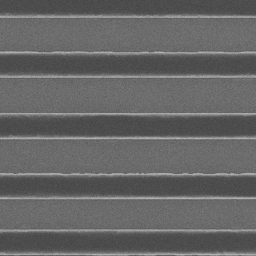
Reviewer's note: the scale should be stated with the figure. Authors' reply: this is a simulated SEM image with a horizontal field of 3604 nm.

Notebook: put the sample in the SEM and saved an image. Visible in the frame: lines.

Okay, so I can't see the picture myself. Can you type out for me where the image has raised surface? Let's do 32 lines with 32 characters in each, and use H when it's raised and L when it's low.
HHHHHHHHHHHHHHHHHHHHHHHHHHHHHHHH
HHHHHHHHHHHHHHHHHHHHHHHHHHHHHHHH
LLLLLLLLLLLLLLLLLLLLLLLLLLLLLLLL
LLLLLLLLLLLLLLLLLLLLLLLLLLLLLLLL
LLLLLLLLLLLLLLLLLLLLLLLLLLLLLLLL
LLLLLLLLLLLLLLLLLLLLLLLLLLLLLLLL
LLLLLLLLLLLLLLLLLLLLLLLLLLLLLLLL
HHHHHHHHHHHHHHHHHHHHHHHHHHHHHHHH
HHHHHHHHHHHHHHHHHHHHHHHHHHHHHHHH
HHHHHHHHHHHHHHHHHHHHHHHHHHHHHHHH
LLLLLLLLLLLLLLLLLLLLLLLLLLLLLLLL
LLLLLLLLLLLLLLLLLLLLLLLLLLLLLLLL
LLLLLLLLLLLLLLLLLLLLLLLLLLLLLLLL
LLLLLLLLLLLLLLLLLLLLLLLLLLLLLLLL
HHHHHHHHHHHHHHHHHHHHHHHHHHHHHHHH
HHHHHHHHHHHHHHHHHHHHHHHHHHHHHHHH
HHHHHHHHHHHHHHHHHHHHHHHHHHHHHHHH
LLLLLLLLLLLLLLLLLLLLLLLLLLLLLLLL
LLLLLLLLLLLLLLLLLLLLLLLLLLLLLLLL
LLLLLLLLLLLLLLLLLLLLLLLLLLLLLLLL
LLLLLLLLLLLLLLLLLLLLLLLLLLLLLLLL
LLLLLLLLLLLLLLLLLLLLLLLLLLLLLLLL
HHHHHHHHHHHHHHHHHHHHHHHHHHHHHHHH
HHHHHHHHHHHHHHHHHHHHHHHHHHHHHHHH
HHHHHHHHHHHHHHHHHHHHHHHHHHHHHHHH
LLLLLLLLLLLLLLLLLLLLLLLLLLLLLLLL
LLLLLLLLLLLLLLLLLLLLLLLLLLLLLLLL
LLLLLLLLLLLLLLLLLLLLLLLLLLLLLLLL
LLLLLLLLLLLLLLLLLLLLLLLLLLLLLLLL
HHHHHHHHHHHHHHHHHHHHHHHHHHHHHHHH
HHHHHHHHHHHHHHHHHHHHHHHHHHHHHHHH
HHHHHHHHHHHHHHHHHHHHHHHHHHHHHHHH